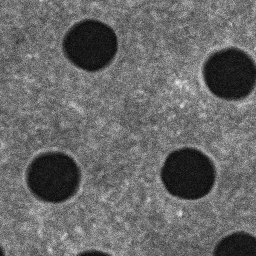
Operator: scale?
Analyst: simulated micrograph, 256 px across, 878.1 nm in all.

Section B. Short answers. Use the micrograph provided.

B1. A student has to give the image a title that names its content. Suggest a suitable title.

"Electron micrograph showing holes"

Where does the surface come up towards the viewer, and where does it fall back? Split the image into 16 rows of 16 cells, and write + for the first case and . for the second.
++++++++++++++++
+++++..+++++++++
++++...+++++++++
++++...++++++...
+++++++++++++...
+++++++++++++...
++++++++++++++++
++++++++++++++++
++++++++++++++++
+++++++++++..+++
++...+++++...+++
++...+++++...+++
+++.++++++++++++
++++++++++++++++
++++++++++++++++
+++++++++++++...